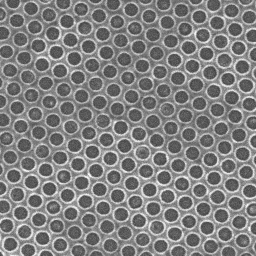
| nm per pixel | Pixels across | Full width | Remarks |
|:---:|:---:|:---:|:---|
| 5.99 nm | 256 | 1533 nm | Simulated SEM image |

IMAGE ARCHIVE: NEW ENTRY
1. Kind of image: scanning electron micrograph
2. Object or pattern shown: a regular array of holes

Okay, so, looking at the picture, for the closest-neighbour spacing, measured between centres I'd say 0.112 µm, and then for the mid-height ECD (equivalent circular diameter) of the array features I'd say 0.0847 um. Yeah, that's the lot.